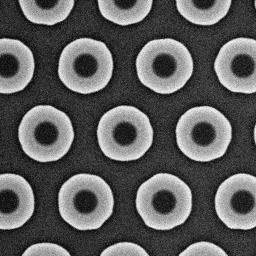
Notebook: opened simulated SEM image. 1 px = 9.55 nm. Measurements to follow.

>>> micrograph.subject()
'an array of small figures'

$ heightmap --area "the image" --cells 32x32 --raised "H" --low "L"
LLHHHHHHHLLLHHHHHHHLLLHHHHHHHLLL
LLLHHHHHHLLLLHHHHHHLLLLHHHHHLLLL
LLLLHHHHLLLLLLHHHHLLLLLLHHHLLLLL
LLLLLLLLLLLLLLLLLLLLLLLLLLLLLLLL
LLLLLLLLLLLLLLLLLLLLLLLLLLLLLLLL
HHHLLLLLLHHHHLLLLLHHHHHLLLLLHHHH
HHHHLLLLHHHHHHLLLLHHHHHHLLLHHHHH
HHHHLLLHHHHHHHLLLHHHHHHHLLLHHHHH
HHHHLLLHHHHHHHLLLHHHHHHHLLLHHHHH
HHHHLLLHHHHHHHLLLHHHHHHHLLLHHHHH
HHHLLLLLHHHHHLLLLLHHHHHLLLLLHHHH
HHLLLLLLLLHLLLLLLLLLHHLLLLLLLLHH
LLLLLLLLLLLLLLLLLLLLLLLLLLLLLLLL
LLLLHHHLLLLLLLHHHLLLLLLLHHHLLLLL
LLLHHHHHLLLLLHHHHHLLLLLHHHHHLLLL
LLLHHHHHHLLLHHHHHHHLLLHHHHHHHLLL
LLHHHHHHHLLLHHHHHHHLLLHHHHHHHLLL
LLHHHHHHHLLLHHHHHHHLLLHHHHHHHLLL
LLLHHHHHHLLLLHHHHHHLLLLHHHHHLLLL
LLLLHHHHLLLLLHHHHHLLLLLHHHHHLLLL
LLLLLLLLLLLLLLLLLLLLLLLLLLLLLLLL
LLLLLLLLLLLLLLLLLLLLLLLLLLLLLLLL
HHHLLLLLLHHHHLLLLLLHHHHLLLLLHHHH
HHHHLLLLHHHHHHLLLHHHHHHHLLLHHHHH
HHHHLLLHHHHHHHLLLHHHHHHHLLLHHHHH
HHHHLLLHHHHHHHLLLHHHHHHHLLLHHHHH
HHHHLLLLHHHHHHLLLHHHHHHHLLLHHHHH
HHHLLLLLHHHHHLLLLLHHHHHLLLLLHHHH
HHLLLLLLLLHHLLLLLLLHHLLLLLLLLHHL
LLLLLLLLLLLLLLLLLLLLLLLLLLLLLLLL
LLLLLHHLLLLLLLLHHLLLLLLLHHHLLLLL
LLLHHHHHLLLLLHHHHHLLLLLHHHHHLLLL